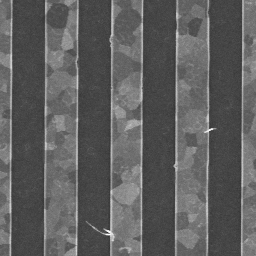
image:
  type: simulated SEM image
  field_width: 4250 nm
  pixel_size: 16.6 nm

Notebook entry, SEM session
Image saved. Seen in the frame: one or a few lines or trenches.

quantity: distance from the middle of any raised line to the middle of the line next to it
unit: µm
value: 1.09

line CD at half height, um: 0.529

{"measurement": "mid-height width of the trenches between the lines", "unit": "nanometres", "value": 571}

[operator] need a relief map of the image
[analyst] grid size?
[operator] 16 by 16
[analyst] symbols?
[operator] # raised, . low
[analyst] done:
#..##..##..##..#
#..##..##..##..#
#..##..##..##..#
#..##..##..##..#
#..##..##..##..#
#..##..##..##..#
#..##..##..##..#
#..##..##..##..#
#..##..##..##..#
#..##..##..##..#
#..##..##..##..#
#..##..##..##..#
#..##..##..##..#
#..##..##..##..#
#..##..##..##..#
#..##..##..##..#